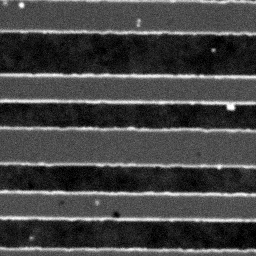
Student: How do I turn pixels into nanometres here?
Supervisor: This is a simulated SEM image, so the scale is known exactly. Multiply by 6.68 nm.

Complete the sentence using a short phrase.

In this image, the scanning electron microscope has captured lines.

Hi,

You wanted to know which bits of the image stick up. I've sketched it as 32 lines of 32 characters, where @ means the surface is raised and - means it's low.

@@@@@@@@@@@@@@@@@@@@@@@@@@@@@@@@
@@@@@@@@@@@@@@@@@@@@@@@@@@@@@@@@
@@@@@@@@@@@@@@@@@@@@@@@@@@@@@@@@
@@@@@@@@@@@@@@@@@@@@@@@@@@@@@@@@
--------------------------------
--------------------------------
--------------------------------
--------------------------------
--------------------------------
@@@@@@@@@@@@@@@@@@@@@@@@--------
@@@@@@@@@@@@@@@@@@@@@@@@@@@@@@@@
@@@@@@@@@@@@@@@@@@@@@@@@@@@@@@@@
@@@@@@@@@@@@@@@@@@@@@@@@@@@@@@@@
--------------------------------
--------------------------------
--------------------------------
@@@@@@@@@@@@@@@@@@@@@@@@@@@@@@@@
@@@@@@@@@@@@@@@@@@@@@@@@@@@@@@@@
@@@@@@@@@@@@@@@@@@@@@@@@@@@@@@@@
@@@@@@@@@@@@@@@@@@@@@@@@@@@@@@@@
@-@@@@@@@@@@@@@@@@@@@@@@@@@@@@@@
--------------------------------
--------------------------------
--------------------------------
@@@@@@@@@@@@@@@@@@@@@@@@@@@@@@@@
@@@@@@@@@@@@@@@@@@@@@@@@@@@@@@@@
@@@@@@@@@@@@@@@@@@@@@@@@@@@@@@@@
--------------------------@@@@@@
--------------------------------
--------------------------------
--------------------------------
@@@@@@@@@@@@@@@@@@@@@@@@@@@@@@@@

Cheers